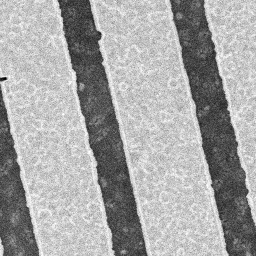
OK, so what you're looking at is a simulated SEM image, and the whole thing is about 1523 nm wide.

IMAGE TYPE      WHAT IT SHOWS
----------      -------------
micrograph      one or a few lines or trenches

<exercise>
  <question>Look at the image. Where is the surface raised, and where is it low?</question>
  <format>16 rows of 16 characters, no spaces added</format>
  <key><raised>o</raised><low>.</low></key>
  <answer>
oooo..ooooo..ooo
oooo..ooooo..ooo
oooo..ooooo..ooo
oooo...oooo...oo
ooooo..ooooo..oo
ooooo..ooooo..oo
ooooo..ooooo..oo
.oooo..ooooo..oo
.oooo...oooo...o
.ooooo..ooooo..o
.ooooo..ooooo..o
..oooo..ooooo..o
..oooo...oooo...
..ooooo..ooooo..
..ooooo..ooooo..
..ooooo..ooooo..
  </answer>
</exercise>